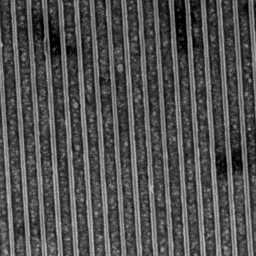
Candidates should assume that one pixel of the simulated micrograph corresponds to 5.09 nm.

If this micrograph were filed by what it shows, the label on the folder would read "parallel lines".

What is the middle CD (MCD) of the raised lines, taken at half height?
18.4 nm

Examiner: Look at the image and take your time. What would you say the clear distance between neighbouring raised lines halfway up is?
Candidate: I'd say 60.3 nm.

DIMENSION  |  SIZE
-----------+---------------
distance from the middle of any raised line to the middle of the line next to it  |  80.5 nanometres